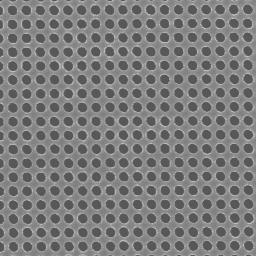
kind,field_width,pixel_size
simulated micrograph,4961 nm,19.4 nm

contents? a regular array of holes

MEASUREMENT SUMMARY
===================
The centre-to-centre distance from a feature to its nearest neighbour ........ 266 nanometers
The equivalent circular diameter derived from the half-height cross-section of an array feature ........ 187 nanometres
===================